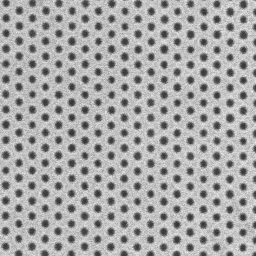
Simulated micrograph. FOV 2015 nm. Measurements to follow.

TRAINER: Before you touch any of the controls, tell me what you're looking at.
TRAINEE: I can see a regular array of holes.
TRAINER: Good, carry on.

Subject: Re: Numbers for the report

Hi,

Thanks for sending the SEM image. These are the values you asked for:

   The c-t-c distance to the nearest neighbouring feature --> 118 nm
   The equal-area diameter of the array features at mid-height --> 67.6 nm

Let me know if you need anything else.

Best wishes